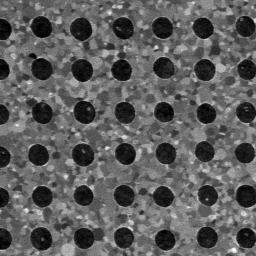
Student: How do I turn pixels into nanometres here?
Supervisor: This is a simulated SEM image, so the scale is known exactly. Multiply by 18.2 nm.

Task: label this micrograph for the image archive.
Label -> a regular array of holes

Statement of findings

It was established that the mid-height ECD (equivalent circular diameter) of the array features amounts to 402 nanometres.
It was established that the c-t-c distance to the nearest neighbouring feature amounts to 0.728 µm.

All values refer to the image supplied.